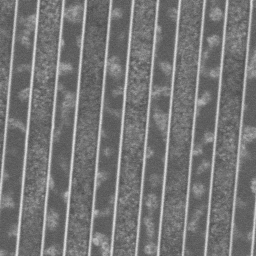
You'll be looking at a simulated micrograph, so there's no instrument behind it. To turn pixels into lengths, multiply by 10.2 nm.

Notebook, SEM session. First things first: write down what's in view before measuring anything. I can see parallel lines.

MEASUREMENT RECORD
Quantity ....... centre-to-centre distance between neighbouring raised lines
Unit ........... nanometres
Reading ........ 476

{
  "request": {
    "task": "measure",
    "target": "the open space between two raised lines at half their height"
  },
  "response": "244 nanometres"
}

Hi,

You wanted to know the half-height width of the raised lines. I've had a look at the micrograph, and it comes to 228 nm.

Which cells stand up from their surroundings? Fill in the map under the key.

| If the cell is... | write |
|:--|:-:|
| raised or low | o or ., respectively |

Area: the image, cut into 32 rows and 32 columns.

..ooo...ooo...ooo...oo....oo...o
..ooo...ooo...ooo...oo...ooo...o
..ooo...ooo...oo....oo...ooo...o
..ooo...oo....oo...ooo...ooo...o
..oo...ooo....oo...ooo...ooo...o
..oo...ooo...ooo...ooo...ooo...o
.ooo...ooo...ooo...ooo...ooo...o
.ooo...ooo...ooo...ooo...ooo...o
.ooo...ooo...ooo...ooo...ooo...o
.ooo...ooo...ooo...ooo...ooo...o
.ooo...ooo...ooo...ooo...ooo...o
.ooo...ooo...ooo...oo....oo...oo
.ooo...ooo...ooo...oo...ooo...oo
.ooo...ooo...oo....oo...ooo...oo
.ooo...oo....oo...ooo...ooo...oo
.ooo...oo...ooo...ooo...ooo...oo
.oo...ooo...ooo...ooo...ooo...oo
.oo...ooo...ooo...ooo...ooo...oo
ooo...ooo...ooo...ooo...ooo...oo
ooo...ooo...ooo...ooo...ooo...oo
ooo...ooo...ooo...ooo...ooo...oo
ooo...ooo...ooo...ooo...ooo...oo
ooo...ooo...ooo...ooo...oo....oo
ooo...ooo...ooo...oo....oo...ooo
ooo...ooo...ooo...oo...ooo...ooo
ooo...ooo...oo....oo...ooo...ooo
ooo...oo....oo...ooo...ooo...ooo
ooo...oo....oo...ooo...ooo...ooo
oo....oo...ooo...ooo...ooo...ooo
oo...ooo...ooo...ooo...ooo...ooo
oo...ooo...ooo...ooo...ooo...ooo
oo...ooo...ooo...ooo...ooo...ooo